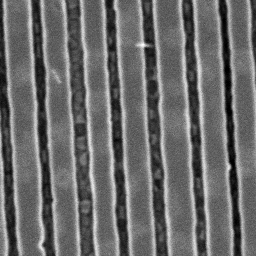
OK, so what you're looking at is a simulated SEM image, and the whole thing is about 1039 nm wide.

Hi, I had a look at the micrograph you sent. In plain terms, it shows parallel lines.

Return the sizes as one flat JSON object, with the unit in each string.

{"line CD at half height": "103 nanometers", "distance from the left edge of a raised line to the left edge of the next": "152 nm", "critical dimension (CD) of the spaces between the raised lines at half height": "45.6 nm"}